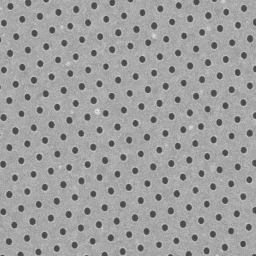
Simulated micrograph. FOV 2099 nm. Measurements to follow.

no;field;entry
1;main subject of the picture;a regular array of holes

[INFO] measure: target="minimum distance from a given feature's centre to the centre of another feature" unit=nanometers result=144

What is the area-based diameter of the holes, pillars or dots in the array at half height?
54 nanometres